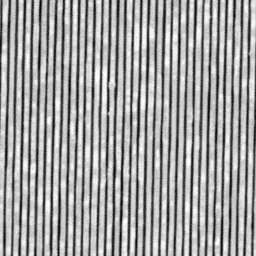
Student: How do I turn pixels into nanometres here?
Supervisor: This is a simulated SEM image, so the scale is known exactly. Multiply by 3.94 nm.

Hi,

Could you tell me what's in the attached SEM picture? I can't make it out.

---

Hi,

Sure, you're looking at parallel lines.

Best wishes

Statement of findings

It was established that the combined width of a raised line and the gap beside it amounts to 7.77 px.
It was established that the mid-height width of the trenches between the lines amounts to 11.3 nm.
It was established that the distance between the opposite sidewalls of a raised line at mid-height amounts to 18.7 nanometres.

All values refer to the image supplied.